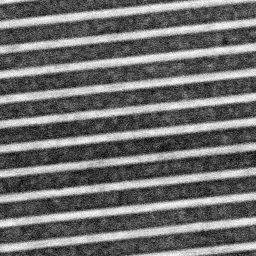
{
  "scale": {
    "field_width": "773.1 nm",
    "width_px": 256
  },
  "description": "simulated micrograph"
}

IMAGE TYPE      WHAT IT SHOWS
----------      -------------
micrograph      parallel lines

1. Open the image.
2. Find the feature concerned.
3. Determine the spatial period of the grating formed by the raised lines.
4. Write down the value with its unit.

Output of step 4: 74.6 nm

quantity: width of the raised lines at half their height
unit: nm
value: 19.2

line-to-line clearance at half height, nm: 55.2